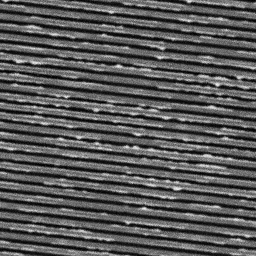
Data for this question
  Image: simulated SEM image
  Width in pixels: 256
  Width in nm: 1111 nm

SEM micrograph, parallel lines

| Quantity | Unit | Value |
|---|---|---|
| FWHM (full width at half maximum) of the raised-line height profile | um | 0.0258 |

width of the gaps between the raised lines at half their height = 18.3 nanometres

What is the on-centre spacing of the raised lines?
9.86 pixels